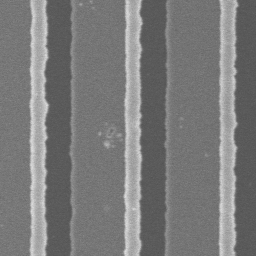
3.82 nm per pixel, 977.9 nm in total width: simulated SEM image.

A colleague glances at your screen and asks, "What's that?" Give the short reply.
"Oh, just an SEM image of lines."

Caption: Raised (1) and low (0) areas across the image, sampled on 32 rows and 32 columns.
11111100011111111100011111111100
11111100011111111000011111111000
11111100011111111100011111111000
11111100011111111100011111111000
11111100011111111000011111111000
11111100011111111100011111111000
11111100011111111100011111111000
11111100011111111000011111111000
11111100011111111000011111111000
11111100011111111000011111111000
11111100011111111100011111111000
11111100011111111100011111111000
11111100011111111100011111111000
11111100011111111000011111111000
11111100011111111100011111111000
11111100011111111000011111111100
11111100011111111100011111111000
11111100011111111000011111111000
11111100011111111100011111111000
11111100011111111100011111111000
11111100011111111100011111111000
11111100011111111100011111111000
11111100011111111100011111111000
11111100011111111100011111111000
11111100011111111100011111111000
11111100011111111000011111111000
11111100011111111100011111111000
11111100011111111100011111111000
11111100011111111100011111111000
11111100011111111000011111111000
11111100011111111100011111111000
11111100011111111000011111111000